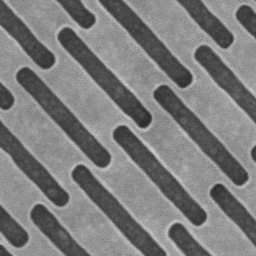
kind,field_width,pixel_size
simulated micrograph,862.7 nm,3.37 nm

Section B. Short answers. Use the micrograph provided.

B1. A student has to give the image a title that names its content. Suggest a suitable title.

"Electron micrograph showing holes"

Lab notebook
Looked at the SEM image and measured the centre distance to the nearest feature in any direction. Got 194 nm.